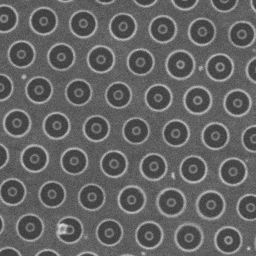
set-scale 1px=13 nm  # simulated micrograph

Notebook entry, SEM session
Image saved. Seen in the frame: an array of small figures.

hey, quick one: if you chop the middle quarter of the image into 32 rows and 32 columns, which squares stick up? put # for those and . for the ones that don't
.#####......####...#..####..##..
#######....######.....####......
##################..#######.....
############################..##
##...###########################
#.....######....######...#######
#..#...####.....#####.....#####.
#..##..####..##..####......####.
#.....#####..#...###...#...###..
##....#####.....#####......###..
############...######.....#####.
#######################..######.
################################
.######...######################
.####......#####....#######..###
.####..##..####......####.....##
.####..##..####..##..####......#
.####......####......####..##..#
######....#####.....#####......#
#################..#######....##
################################
#...############################
.....######...##################
..#...####.....#####....#######.
..#...###...#...####.....#####..
.....####...#...###...#..####...
.....#####.....####...#..####..#
##.########...######.....####...
#####################...######..
################################
######...#######################
####......#####....#######..####